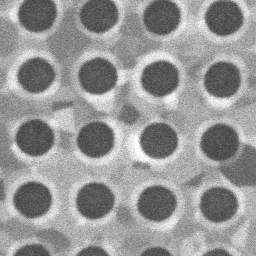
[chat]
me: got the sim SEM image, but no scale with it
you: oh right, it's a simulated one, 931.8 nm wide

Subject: a regular array of holes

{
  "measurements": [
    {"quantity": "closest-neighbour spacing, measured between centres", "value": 223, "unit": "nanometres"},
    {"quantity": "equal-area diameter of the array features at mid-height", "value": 0.145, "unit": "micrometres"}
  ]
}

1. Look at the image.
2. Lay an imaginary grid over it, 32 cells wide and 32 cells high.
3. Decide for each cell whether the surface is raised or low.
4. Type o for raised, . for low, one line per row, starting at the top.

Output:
oo.....ooo.....ooo....oooo....oo
oo.....ooo.....ooo.....ooo....oo
oo.....ooo.....ooo.....ooo....oo
ooo...ooooo...oooo....oooo....oo
ooooooooooooooooooo..oooooo..ooo
oooooooooooooooooooooooooooooooo
oooooooooooooooooooooooooooooooo
ooo...ooooo...ooooo..ooooooooooo
oo.....ooo.....ooo....oooo....oo
oo.....ooo.....oo......oo.....oo
oo.....ooo.....oo......oo.....oo
ooo...ooooo...oooo....oooo....oo
oooooooooooooooooooooooooooooooo
oooooooooooooooooooooooooooooooo
oooooooooooooooooooooooooooooooo
ooo...ooooo..ooooo...oooooo..ooo
oo.....ooo....ooo.....ooo.....oo
oo.....oo......oo.....ooo.....oo
oo....oooo....ooo.....ooo.....oo
oooo.oooooo..ooooo...ooooo...ooo
oooooooooooooooooooooooooooooooo
oooooooooooooooooooooooooooooooo
oooooooooooooooooooooooooooooooo
oo....oooo....oooo...ooooo...ooo
oo.....oo.....ooo.....ooo.....oo
oo.....oo.....ooo.....ooo.....oo
oo....oooo....ooo.....ooo.....oo
ooooooooooo..ooooo...ooooo...ooo
oooooooooooooooooooooooooooooooo
oooooooooooooooooooooooooooooooo
ooo..ooooooooooooooooooooooooooo
oo....oooo....oooo...ooooo...ooo